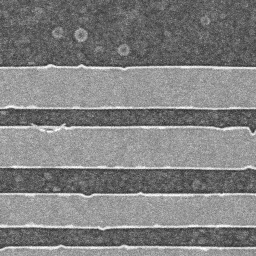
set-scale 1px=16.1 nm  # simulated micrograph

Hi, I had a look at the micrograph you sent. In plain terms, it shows parallel lines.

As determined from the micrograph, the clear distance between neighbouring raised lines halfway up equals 331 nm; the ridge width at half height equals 41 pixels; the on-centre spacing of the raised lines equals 989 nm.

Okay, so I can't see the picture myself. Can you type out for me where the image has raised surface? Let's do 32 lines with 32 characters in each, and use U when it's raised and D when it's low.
DDDDDDDDDDDDDDDDDDDDDDDDDDDDDDDD
DDDDDDDDDDDDDDDDDDDDDDDDDDDDDDDD
DDDDDDDDDDDDDDDDDDDDDDDDDDDDDDDD
DDDDDDDDDDDDDDDDDDDDDDDDDDDDDDDD
DDDDDDDDDDDDDDDDDDDDDDDDDDDDDDDD
DDDDDDDDDDDDDDDDDDDDDDDDDDDDDDDD
DDDDDDDDDDDDDDDDDDDDDDDDDDDDDDDD
DDDDDDDDDDDDDDDDDDDDDDDDDDDDDDDD
DDDDUUUUUUUDDDDDUUUUUUUUUUUUUDDD
UUUUUUUUUUUUUUUUUUUUUUUUUUUUUUUU
UUUUUUUUUUUUUUUUUUUUUUUUUUUUUUUU
UUUUUUUUUUUUUUUUUUUUUUUUUUUUUUUU
UUUUUUUUUUUUUUUUUUUUUUUUUUUUUUUU
UDUUUUUUUUUUUUDDDDDDDDDDUUUUUUDD
DDDDDDDDDDDDDDDDDDDDDDDDDDDDDDDD
DDDDDDDDDDDDDDDDDDDDDDDDDDDDDDDD
UUUUUUUUUUUUUUUUUUUUUUUUUUUUUUUD
UUUUUUUUUUUUUUUUUUUUUUUUUUUUUUUU
UUUUUUUUUUUUUUUUUUUUUUUUUUUUUUUU
UUUUUUUUUUUUUUUUUUUUUUUUUUUUUUUU
UUUUUUUUUUUUUUUUUUUUUUUUUUUUUUUU
DDDDDDDDDDDDDDDDDDDDDDDDDDDDDDDD
DDDDDDDDDDDDDDDDDDDDDDDDDDDDDDDD
DDDDDDDDDDDDDDDDDDDDDDDDDDDDDDDD
UUUUUUUUUUDUUUUUUUUUUUUUUUUUUUUU
UUUUUUUUUUUUUUUUUUUUUUUUUUUUUUUU
UUUUUUUUUUUUUUUUUUUUUUUUUUUUUUUU
UUUUUUUUUUUUUUUUUUUUUUUUUUUUUUUU
DDDDDDDDDDDDUUDDDDDDDDDDDDDDDDDD
DDDDDDDDDDDDDDDDDDDDDDDDDDDDDDDD
DDDDDDDDDDDDDDDDDDDDDDDDDDDDDDDD
UUUUUUUUUUUUUUUUUUUUUUUUUUUUUUUU